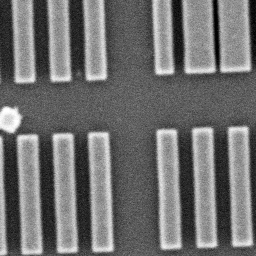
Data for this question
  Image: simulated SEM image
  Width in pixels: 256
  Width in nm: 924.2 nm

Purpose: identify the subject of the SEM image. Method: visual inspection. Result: groups of lines, slits or small figures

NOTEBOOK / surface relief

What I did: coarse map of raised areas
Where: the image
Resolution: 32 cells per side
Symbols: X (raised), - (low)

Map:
--XX--XX---XX------XX--XXXXXXXX-
--XX--XX---XX------XX--XXXXXXXX-
--XX--XXX--XX------XX--XXXXXXXX-
--XX--XXX--XX------XX--XXXXXXXX-
--XX--XXX--XX------XX--XXXXXXXX-
--XX--XXX--XX------XX--XXXXXXXX-
--XX--XXX--XX-------X--XXXX-XXX-
--XX--XXX--XX-------XX-XXXX-XXX-
--XX--XXX--XX-------XX-XXXX-XXX-
--XX--XXX--XX-------------------
--------------------------------
--------------------------------
--------------------------------
--------------------------------
--------------------------------
--------------------------------
--------------------XX--XXX--XX-
--XXX--XX--XX-------XX--XXX--XX-
--XXX--XX--XX-------XX--XXX--XX-
--XXX--XX--XXX------XX--XXX--XX-
--XXX--XX--XXX------XX--XXX--XX-
--XXX--XX--XXX------XX--XXX--XX-
--XXX--XX--XXX------XX--XXX--XX-
--XXX--XX--XXX------XX--XXX--XX-
---XX--XX--XXX------XX--XXX--XX-
---XX--XX--XXX------XX--XXX--XX-
X--XX--XX---XX------XX--XXX--XX-
X--XX--XX---XX------XX---XX--XX-
X--XX--XX---XX------XX---XX--XX-
X--XX--XX---XX------XXX--XX--XX-
X--XX--XX---XX------XXX--XX--XX-
X--XX---X-----------------------